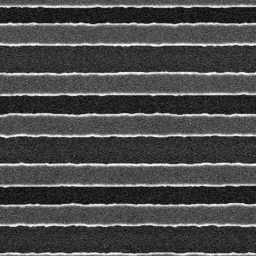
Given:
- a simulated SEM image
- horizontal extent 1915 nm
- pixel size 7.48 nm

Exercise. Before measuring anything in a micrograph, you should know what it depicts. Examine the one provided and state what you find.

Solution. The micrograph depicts lines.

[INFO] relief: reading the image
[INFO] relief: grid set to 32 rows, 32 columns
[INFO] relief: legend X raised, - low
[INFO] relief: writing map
XXXXXXXXXXXXXXXXXXXXXXXXXXXXXXXX
--------------------------------
--------------------------------
XXXXXXXXXXXXXXXXXXXXXXXXXXXXXXXX
XXXXXXXXXXXXXXXXXXXXXXXXXXXXXXXX
XXXXXXXXXXXXXXXXXXXXXXXXXXXXXXXX
--------------------------------
--------------------------------
--------------------------------
XXXXXXXXXXXXXXXXXXXXXXXXXXXXXXXX
XXXXXXXXXXXXXXXXXXXXXXXXXXXXXXXX
XXXXXXXXXXXXXXXXXXXXXXXXXXXXXXXX
--------------------------------
--------------------------------
XXXXXXXXXXXXXXXXXXXXXXXXXXXXXXXX
XXXXXXXXXXXXXXXXXXXXXXXXXXXXXXXX
XXXXXXXXXXXXXXXXXXXXXXXXXXXXXXXX
--------------------------------
--------------------------------
--------------------------------
--X--X--X----------------XXXXXX-
XXXXXXXXXXXXXXXXXXXXXXXXXXXXXXXX
XXXXXXXXXXXXXXXXXXXXXXXXXXXXXXXX
--------------------------------
--------------------------------
--------XX----X-------------XXX-
XXXXXXXXXXXXXXXXXXXXXXXXXXXXXXXX
XXXXXXXXXXXXXXXXXXXXXXXXXXXXXXXX
--------------------------------
--------------------------------
--------------------------------
--------------------------------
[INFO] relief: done